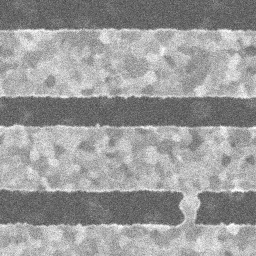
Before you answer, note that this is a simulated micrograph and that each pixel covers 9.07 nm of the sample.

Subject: one or a few lines or trenches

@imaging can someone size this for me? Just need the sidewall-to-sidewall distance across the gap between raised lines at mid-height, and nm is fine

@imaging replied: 293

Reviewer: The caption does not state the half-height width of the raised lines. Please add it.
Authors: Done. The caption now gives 594 nm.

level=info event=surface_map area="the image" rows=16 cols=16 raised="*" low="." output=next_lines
................
................
****************
****************
****************
****************
................
................
****************
****************
****************
****************
...........*....
...........*....
****************
****************